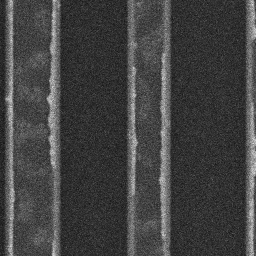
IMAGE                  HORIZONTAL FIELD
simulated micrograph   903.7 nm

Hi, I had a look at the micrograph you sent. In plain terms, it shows one or a few lines or trenches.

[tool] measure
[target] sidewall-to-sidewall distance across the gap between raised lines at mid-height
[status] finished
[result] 269 nanometres